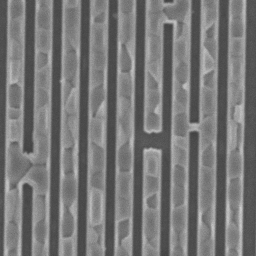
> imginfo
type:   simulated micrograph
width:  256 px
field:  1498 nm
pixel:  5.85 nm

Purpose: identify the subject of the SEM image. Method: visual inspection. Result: parallel lines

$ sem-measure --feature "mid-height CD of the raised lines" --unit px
16.7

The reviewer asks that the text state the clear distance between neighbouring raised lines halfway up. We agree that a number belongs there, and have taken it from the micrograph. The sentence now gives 63.6 nanometers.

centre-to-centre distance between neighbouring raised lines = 161 nanometers